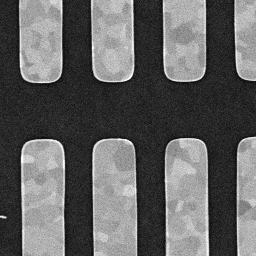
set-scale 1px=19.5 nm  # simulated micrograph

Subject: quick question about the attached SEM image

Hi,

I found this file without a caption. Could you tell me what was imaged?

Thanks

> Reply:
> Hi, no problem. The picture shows groups of lines, slits or small figures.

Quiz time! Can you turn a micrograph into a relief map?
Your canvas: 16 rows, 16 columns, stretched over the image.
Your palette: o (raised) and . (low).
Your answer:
.ooo..oo..ooo..o
.ooo..oo..ooo..o
.ooo..oo..ooo..o
.ooo..oo..ooo..o
.ooo..oo..ooo..o
................
................
................
................
.ooo..oo..ooo..o
.ooo..oo..ooo..o
.ooo..oo..ooo..o
.ooo..oo..ooo..o
.ooo..ooo.ooo..o
.ooo..ooo.ooo..o
.ooo..ooo.ooo..o